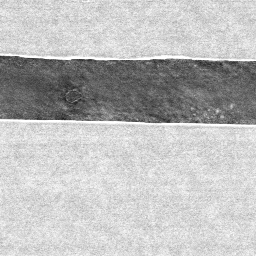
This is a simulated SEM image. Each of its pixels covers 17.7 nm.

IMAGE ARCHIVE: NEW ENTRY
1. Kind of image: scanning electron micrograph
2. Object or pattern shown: one or a few lines or trenches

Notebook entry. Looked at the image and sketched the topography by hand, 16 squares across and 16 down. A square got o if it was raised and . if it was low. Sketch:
oooooooooooooooo
oooooooooooooooo
oooooooooooooooo
.ooooooooooooooo
................
................
................
................
oooooooooooooooo
oooooooooooooooo
oooooooooooooooo
oooooooooooooooo
oooooooooooooooo
oooooooooooooooo
oooooooooooooooo
oooooooooooooooo